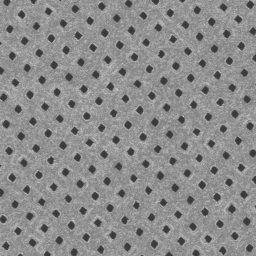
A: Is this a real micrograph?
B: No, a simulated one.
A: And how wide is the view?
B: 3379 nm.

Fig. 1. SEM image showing a regular array of holes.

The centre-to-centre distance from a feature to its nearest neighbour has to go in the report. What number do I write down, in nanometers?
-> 248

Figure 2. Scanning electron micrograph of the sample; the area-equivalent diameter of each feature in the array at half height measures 95.4 nanometres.